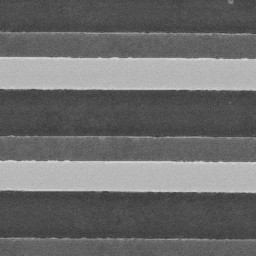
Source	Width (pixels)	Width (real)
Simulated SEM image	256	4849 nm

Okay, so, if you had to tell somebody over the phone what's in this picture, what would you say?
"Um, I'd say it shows lines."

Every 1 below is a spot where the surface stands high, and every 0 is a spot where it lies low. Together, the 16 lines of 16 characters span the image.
0000000000000000
0000000000000000
1111111111111111
1111111111111111
1111111111111111
1111111111111111
0000000000000000
0000000000000000
0000000000000000
1111111111111111
1111111111111111
1111111111111111
0000000000000000
0000000000000000
0000000000000000
1111111111111111